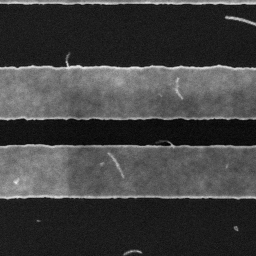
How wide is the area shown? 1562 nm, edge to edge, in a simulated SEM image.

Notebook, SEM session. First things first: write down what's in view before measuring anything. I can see lines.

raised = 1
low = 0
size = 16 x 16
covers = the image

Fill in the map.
0000000000000000
0000000000000000
0000000000000000
0000000000000000
1111111111111111
1111111111111111
1111111111111111
0000000000000000
0000000000000000
1111111111111111
1111111111111111
1111111111111111
0000000000000000
0000000000000000
0000000000000000
0000000000000000